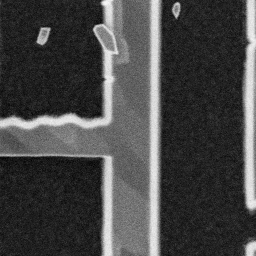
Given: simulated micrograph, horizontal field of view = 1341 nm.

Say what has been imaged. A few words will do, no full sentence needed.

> one or a few lines or trenches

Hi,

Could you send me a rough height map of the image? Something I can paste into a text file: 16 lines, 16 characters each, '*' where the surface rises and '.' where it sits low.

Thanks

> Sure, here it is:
.......***......
......****......
......****......
.......***......
.......***......
.......***......
.......***......
....*.****......
**********......
**********......
.......***......
.......***......
.......***......
.......***......
.......***......
.......***......